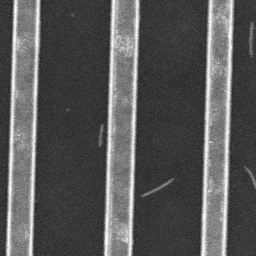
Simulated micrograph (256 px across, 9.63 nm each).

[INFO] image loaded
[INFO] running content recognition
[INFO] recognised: one or a few lines or trenches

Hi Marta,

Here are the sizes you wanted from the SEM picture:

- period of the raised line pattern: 935 nm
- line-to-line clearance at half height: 714 nanometers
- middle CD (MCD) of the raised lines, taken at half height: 211 nm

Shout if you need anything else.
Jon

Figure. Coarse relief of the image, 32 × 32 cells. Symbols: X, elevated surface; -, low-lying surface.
--XXX---------XXX---------XXX---
--XXX---------XXX---------XXX---
--XXX---------XXX---------XXX---
--XXX---------XXX---------XXX---
--XXX---------XXX---------XXX---
--XXX---------XXX---------XXX---
--XXX---------XXX---------XXX---
--XX----------XXX---------XXX---
--XX----------XXX---------XXX---
--XX----------XXX---------XXX---
--XX----------XXX---------XXX---
--XX----------XXX---------XXX---
--XX----------XXX---------XXX---
--XX----------XXX---------XXX---
--XX----------XXX---------XX----
--XX----------XXX---------XX----
--XX----------XXX---------XX----
--XX----------XXX---------XX----
-XXX----------XXX---------XX----
-XXX----------XXX---------XX----
-XXX----------XXX---------XX----
-XXX----------XX----------XX----
-XXX----------XX----------XX----
-XXX----------XX----------XX----
-XXX----------XX----------XX----
-XXX----------XX----------XX----
-XXX---------XXX----------XX----
-XXX---------XXX----------XX----
-XXX---------XXX----------XX----
-XXX---------XXX---------XXX----
-XXX---------XXX---------XXX----
-XXX---------XXX---------XXX----